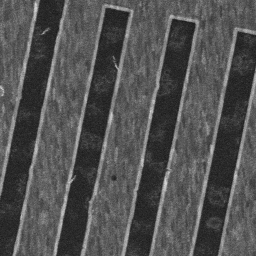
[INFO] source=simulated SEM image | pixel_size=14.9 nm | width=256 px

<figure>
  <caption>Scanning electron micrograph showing one or a few lines or trenches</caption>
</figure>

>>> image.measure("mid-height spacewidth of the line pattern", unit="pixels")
27.5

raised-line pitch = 66.9 px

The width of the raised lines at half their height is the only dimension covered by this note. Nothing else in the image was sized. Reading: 588 nm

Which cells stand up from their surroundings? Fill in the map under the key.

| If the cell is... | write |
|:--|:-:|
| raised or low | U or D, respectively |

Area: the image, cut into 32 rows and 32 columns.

UUUUUDDDUUUUUUUUUUUUUUUUUUUUUUUU
UUUUDDDDUUUUUDDDUUUUUUUUUUUUUUUU
UUUUDDDDUUUUUDDDUUUUUDDDUUUUUUUU
UUUUDDDUUUUUUDDDUUUUUDDDDUUUUUUU
UUUUDDDUUUUUDDDDUUUUUDDDUUUUUDDD
UUUUDDDUUUUUDDDDUUUUUDDDUUUUUDDD
UUUDDDDUUUUUDDDUUUUUDDDDUUUUUDDD
UUUDDDDUUUUUDDDUUUUUDDDDUUUUUDDD
UUUDDDUUUUUUDDDUUUUUDDDDUUUUUDDD
UUUDDDUUUUUDDDDUUUUUDDDUUUUUDDDD
UUUDDDUUUUUDDDDUUUUUDDDUUUUUDDDD
UUDDDDUUUUUDDDUUUUUDDDDUUUUUDDDD
UUDDDDUUUUUDDDUUUUUDDDDUUUUUDDDU
UUDDDUUUUUUDDDUUUUUDDDDUUUUUDDDU
UUDDDUUUUUDDDDUUUUUDDDUUUUUDDDDU
UUDDDUUUUUDDDDUUUUUDDDUUUUUDDDDU
UDDDDUUUUUDDDUUUUUDDDDUUUUUDDDDU
UDDDDUUUUUDDDUUUUUDDDDUUUUUDDDUU
UDDDUUUUUUDDDUUUUUDDDDUUUUUDDDUU
UDDDUUUUUDDDDUUUUUDDDUUUUUDDDDUU
UDDDUUUUUDDDDUUUUUDDDUUUUUDDDDUU
DDDDUUUUUDDDUUUUUUDDDUUUUUDDDDUU
DDDDUUUUUDDDUUUUUDDDDUUUUUDDDUUU
DDDUUUUUUDDDUUUUUDDDDUUUUUDDDUUU
DDDUUUUUDDDDUUUUUDDDUUUUUDDDDUUU
DDDUUUUUDDDUUUUUUDDDUUUUUDDDDUUU
DDDUUUUUDDDUUUUUUDDDUUUUUDDDDUUU
DDDUUUUUDDDUUUUUDDDDUUUUUDDDUUUU
DDDUUUUUDDDUUUUUDDDUUUUUUDDDUUUU
DDUUUUUDDDDUUUUUDDDUUUUUDDDDUUUU
DDUUUUUDDDDUUUUUDDDUUUUUDDDDUUUU
DDUUUUUDDDUUUUUDDDDUUUUUDDDDUUUU